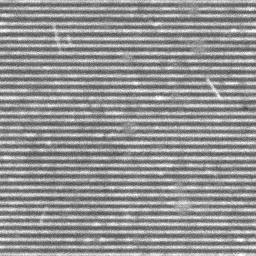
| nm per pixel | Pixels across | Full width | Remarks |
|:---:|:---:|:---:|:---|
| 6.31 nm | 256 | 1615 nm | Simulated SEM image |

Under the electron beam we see parallel lines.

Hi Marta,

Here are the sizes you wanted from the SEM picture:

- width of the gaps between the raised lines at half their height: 33.9 nanometers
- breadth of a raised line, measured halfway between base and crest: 12.6 nanometres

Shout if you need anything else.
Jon